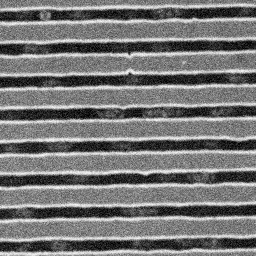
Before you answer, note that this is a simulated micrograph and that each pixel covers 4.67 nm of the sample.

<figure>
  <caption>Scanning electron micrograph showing parallel lines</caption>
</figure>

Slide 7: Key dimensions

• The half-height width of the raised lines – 0.0939 microns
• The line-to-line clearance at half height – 58.9 nanometres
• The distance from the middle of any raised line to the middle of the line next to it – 154 nm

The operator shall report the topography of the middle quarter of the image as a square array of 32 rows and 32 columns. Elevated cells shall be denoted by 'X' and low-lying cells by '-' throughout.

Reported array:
XXXXXXXXXXXXXXXXXXXXXXXXXXXXXXXX
XXXXXXXXXXXXXXXXXXXXXXXXXXXXXXXX
XXXXXXXX-XXXX-------------------
--------------------------------
--------------------------------
----------------------------XX--
XXXXXXXXXXXXXXXXXXXXXXXXXXXXXXXX
XXXXXXXXXXXXXXXXXXXXXXXXXXXXXXXX
XXXXXXXXXXXXXXXXXXXXXXXXXXXXXXXX
XXXXXXXXXXXXXXXXXXXXXXXXXXXXXXXX
XXXXXXXXXXXXXXXXXXXXXXXX------XX
--------------------------------
--------------------------------
--------------------------------
XXXXXXXXXXXXXXXXXXXXXXXXXXXXXXXX
XXXXXXXXXXXXXXXXXXXXXXXXXXXXXXXX
XXXXXXXXXXXXXXXXXXXXXXXXXXXXXXXX
XXXXXXXXXXXXXXXXXXXXXXXXXXXXXXXX
XXXXXXXXXXXXXXXXXXXXXXXXXXXXXXXX
--------------------------------
--------------------------------
--------------------------------
--XXXXXXXXXXXXXXXXXXXXXXXXXXXXXX
XXXXXXXXXXXXXXXXXXXXXXXXXXXXXXXX
XXXXXXXXXXXXXXXXXXXXXXXXXXXXXXXX
XXXXXXXXXXXXXXXXXXXXXXXXXXXXXXXX
XXXXXXXXXXXXXXXXXXXXXXXXXXXXXXXX
--------------------------------
--------------------------------
--------------------------------
-------------XXXXXXXXXXXXXXXXXXX
XXXXXXXXXXXXXXXXXXXXXXXXXXXXXXXX